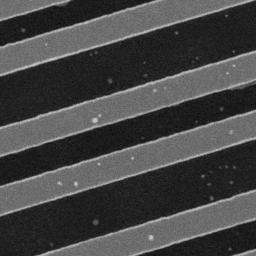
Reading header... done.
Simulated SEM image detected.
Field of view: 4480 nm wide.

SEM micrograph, lines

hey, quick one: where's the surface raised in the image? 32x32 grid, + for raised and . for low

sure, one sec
+++++++...........++++++++++++..
++++...........++++++++++++.....
+..........+++++++++++++........
........++++++++++++............
....+++++++++++++...............
.++++++++++++...................
++++++++++.....................+
+++++++.....................++++
++++.....................+++++++
.....................+++++++++++
..................++++++++++++..
...............++++++++++++.....
............++++++++++++........
........++++++++++++............
.....++++++++++++............+++
.+++++++++++++............++++++
++++++++++.............+++++++++
+++++++.............++++++++++++
++++............++++++++++++....
+............++++++++++++.......
.........++++++++++++...........
......++++++++++++..............
...++++++++++++.................
++++++++++++....................
+++++++++....................+++
+++++.....................++++++
++.....................+++++++++
...................+++++++++++++
................+++++++++++++...
.............++++++++++++.......
.........+++++++++++++..........
......++++++++++++.............+